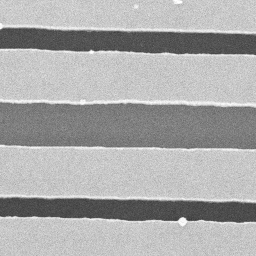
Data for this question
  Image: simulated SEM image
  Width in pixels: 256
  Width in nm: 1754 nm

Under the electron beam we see lines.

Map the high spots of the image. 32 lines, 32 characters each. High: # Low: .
################################
################################
################################
.....###########################
................................
................................
##########.####.................
################################
################################
################################
################################
################################
################################
................................
................................
................................
................................
................................
#############...................
################################
################################
################################
################################
################################
################################
................................
................................
###############.......#.........
################################
################################
################################
################################